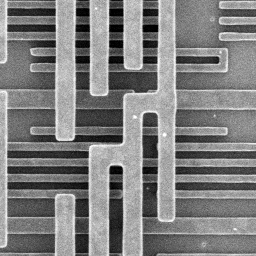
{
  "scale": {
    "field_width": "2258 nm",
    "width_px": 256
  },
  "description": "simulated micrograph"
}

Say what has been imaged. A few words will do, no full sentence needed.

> wiring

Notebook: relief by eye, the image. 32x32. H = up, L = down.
HLLLLLLHHLLHHHLLHHLLHHLLLLLLLLLL
HLLLLLLHHLLHHLLLHHLLHHLLLLLLLLLL
HLLLLLLHHLLHHLLLHHLLHHLLLLLLLLLL
HLLLLLLHHLLHHLLLHHLLHHLLLLLLLLLL
HLLLLLLHHLLHHLLLHHLLHHLLLLLLLLLL
HLLLLLLHHLLHHLLLHHLLHHLLLLLLLLLL
HLLLLLLHHLLHHLLLHHLLHHLLLLLLLLLL
HLLLLLLHHLLHHLLLHHLLHHLLLLLLLLLL
LLLLLLLHHLLHHLLLHHLLHHLLLLLLLLLL
LLLLLLLHHLLHHLLLLLLLHHLLLLLLLLLL
LLLLLLLHHLLHHLLLLLLLHHLLLLLLLLLL
HLLLLLLHHLLHHLLLLLLHHHLLLLLLLLLL
HLLLLLLHHLLLLLLLHHHHHHLLLLLLLLLL
HLLLLLLHHLLLLLLLHHHHHHLLLLLLLLLL
HLLLLLLHHLLLLLLLHHLLHHLLLLLLLLLL
HLLLLLLHHLLLLLLLHHLLHHLLLLLLLLLL
HLLLLLLHHLLLLLLHHHLLHHLLLLLLLLLL
HLLLLLLHHLLLLLLHHHLLHHLLLLLLLLLL
HLLLLLLLLLLHHHHHHHLLHHLLLLLLLLLL
HLLLLLLLLLLHHHHHHHLLHHLLLLLLLLLL
HLLLLLLLLLLHHHHHHHLLHHLLLLLLLLLL
HLLLLLLLLLLHHHLHHHLLHHLLLLLLLLLL
HLLLLLLLLLLHHHLHHHLLHHLLLLLLLLLL
HLLLLLLLLLLHHHLHHHLLHHLLLLLLLLLL
HLLLLLLHHLLHHHLHHHLLHHLLLLLLLLLL
HLLLLLLHHLLHHLLHHHLLHHLLLLLLLLLL
HLLLLLLHHLLHHLLHHHLLHHLLLLLLLLLL
HLLLLLLHHLLHHLLHHHLLHHLLLLLLLLLL
HLLLLLLHHLLHHLLHHHLLLLLLLLLLLLLL
HLLLLLLHHLLHHLLHHHLLLLLLLLLLLLLL
HLLLLLLHHLLHHLLHHHLLLLLLLLLLLLLL
LLLLLLLHHLLHHLLHHHLLLLLLLLLLLLLL